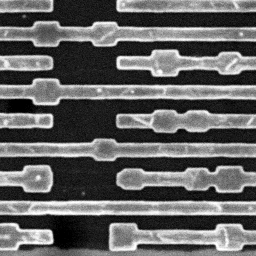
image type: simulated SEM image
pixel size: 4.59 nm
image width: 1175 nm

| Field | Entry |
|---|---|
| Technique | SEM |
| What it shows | wiring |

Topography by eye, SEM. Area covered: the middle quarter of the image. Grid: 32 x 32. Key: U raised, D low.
DDDDDDDDDDDDDUUUUUUUUUUUUUUUUUUU
DDDDDDDDDDDDDDDDDDDDDDUUUUUUUDDD
DDDDDDDDDDDDDDDDDDDDDDUUUUUUDDDD
DDDDDDDDDDDDDDDDDDDDDDDDDDDDDDDD
DDDDDDDDDDDDDDDDDDDDDDDDDDDDDDDD
UUUUUUDDDDDDDDDDDDDDDDDDDDDDDDDD
UUUUUUUUUUUUUUUUUUUUUUUUUUUUUUUU
UUUUUUUUUUUUUUUUUUUUUUUUUUUUUUUU
UUUUUUUUUUUDDDDUUUDDDDDDDDUUUUUU
DDDDDDDDDDDDDDDDDDDDDDDDDDDDDDDD
DDDDDDDDDDDDDDDDDDDDDDDDDDDDDDDD
DDDDDDDDDDDDDDDDDDDDDDDDDDDDDDDD
DDDDDDDDDDDDDDDDDDDDDDUUUUUUUDUU
DDDDDDDDDDDDDUUUUUUUUUUUUUUUUUUU
DDDDDDDDDDDDDUUUUUUUUUUUUUUUUUUU
DDDDDDDDDDDDDUUUUUUUUUUUUUUUUUUU
DDDDDDDDDDDDDDDDDDDDDDDUUUUUDDDU
DDDDDDDDDDDDDDDDDDDDDDDDDDDDDDDD
DDDDDDDDDDDDDDDDDDDDDDDDDDDDDDDD
DDDDDDDUUUUUUDDDDDDDDDDDDDDDDDDD
UUUUUUUUUUUUUUUUUUUUUUUUUUUUUUUU
UUUUUUUUUUUUUUUUUUUUUUUUUUUUUUUU
UUUUUUUUUUUUUUUUUUUUUUUUUUUUUUUU
DDDDDDDDUUUUUDDDDDDDDDDDDDDDDDDD
DDDDDDDDDDDDDDDDDDDDDDDDDDDDDDDD
DDDDDDDDDDDDDDDDDDDDDDDDDDDDDDDD
DDDDDDDDDDDDDDDUUUUDDDDDDDDDDDDU
DDDDDDDDDDDDDDUUUUUUUUUUUUUUUUUU
DDDDDDDDDDDDDUUUUUUUUUUUUUUUUUUU
DDDDDDDDDDDDDUUUUUUUUUUUUUUUUUUU
DDDDDDDDDDDDDDUUUUUUDDDDDDDDDDUU
DDDDDDDDDDDDDDDDDDDDDDDDDDDDDDDD